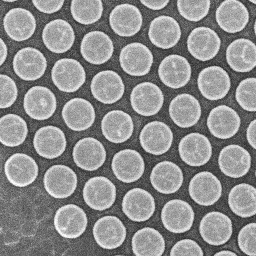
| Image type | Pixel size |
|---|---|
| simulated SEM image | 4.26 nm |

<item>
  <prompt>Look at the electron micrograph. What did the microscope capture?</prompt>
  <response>a regular array of raised bodies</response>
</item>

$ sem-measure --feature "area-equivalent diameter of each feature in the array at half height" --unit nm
132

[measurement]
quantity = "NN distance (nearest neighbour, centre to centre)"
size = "169 nm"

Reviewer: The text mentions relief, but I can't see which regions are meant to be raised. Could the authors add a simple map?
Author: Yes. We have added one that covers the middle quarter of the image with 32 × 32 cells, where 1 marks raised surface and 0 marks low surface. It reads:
11110000000000011111100011111110
11111000000000011111100011111110
11111000011110000110000011111110
11111000111111000000000011111110
11111001111111000000000001111100
11110001111111100001111000011000
11000001111111100011111100000000
00000001111111000111111100000000
00000000111111000111111110001111
01111100001100000111111100011111
11111110000000000111111100011111
11111110000000000011111000011111
11111110000111100000110000011111
11111110001111110000000000011111
11111110001111111000000000001111
01111100001111111000011110000110
00000000001111111000111111000000
00000000001111111001111111100000
00000000000111110001111111100011
00001111000000000001111111100111
00011111100000000000111111000111
00011111110000000000011111000111
00111111110001111110000000000111
00011111110001111110000000000011
00011111110011111111000000000001
00001111100011111111000111110000
11000000000001111111001111111000
11100000000001111110001111111000
11100000000000111110001111111000
11100011111000000000001111111000
11100011111100000000001111111000
11000111111110000000000011110000